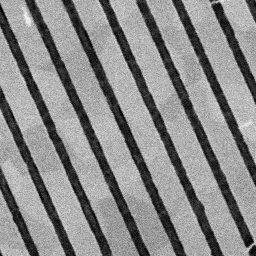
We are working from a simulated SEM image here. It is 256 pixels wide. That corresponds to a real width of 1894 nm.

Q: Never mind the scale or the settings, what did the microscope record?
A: parallel lines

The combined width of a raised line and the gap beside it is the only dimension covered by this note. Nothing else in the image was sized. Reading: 248 nanometres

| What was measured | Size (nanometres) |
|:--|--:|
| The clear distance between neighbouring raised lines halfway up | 77.7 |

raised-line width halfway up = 170 nm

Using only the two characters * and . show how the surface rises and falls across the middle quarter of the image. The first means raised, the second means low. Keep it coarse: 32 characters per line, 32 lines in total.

*******..*******...******...****
.******...******...******...****
.*******..*******...******...***
..******...******...******...***
..*******..*******..*******...**
...******...******...******...**
...******...******...*******...*
*..*******...******...******...*
*...******...******...******...*
*...*******...******...******...
**...******...******...*******..
***..*******..*******...******..
***...******...******...******..
***...*******..*******...******.
****...******...******...******.
****...*******..*******..*******
*****...******...******...******
*****...******...*******..******
******..*******...******...*****
******...******...******...*****
******...*******..*******...****
.******...******...******...****
.******...*******..*******...***
..******...******...******...***
..******...*******..*******..***
..*******...******...******...**
...******...******...*******..**
*..******...*******...******...*
*...******...******...*******..*
*...******...*******...******...
**.*.******...******...******...
**.*.******...******...*******..